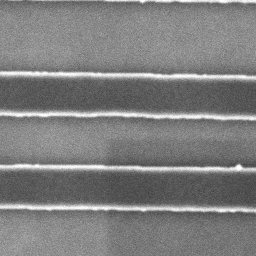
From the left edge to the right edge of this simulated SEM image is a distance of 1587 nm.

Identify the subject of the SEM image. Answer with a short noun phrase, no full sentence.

lines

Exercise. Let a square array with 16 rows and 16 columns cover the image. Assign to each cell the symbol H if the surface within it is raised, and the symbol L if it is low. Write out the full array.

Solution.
LLLLLLLLLLLLLLLL
LLLLLLLLLLLLLLLL
LLLLLLLLLLLLLLLL
LLLLLLLLLLLLLLLL
LLLLLLLLLLLLLLLL
HHHHHHHHHHHHHHHH
HHHHHHHHHHHHHHHH
LLLLLLLLLLLLLLLL
LLLLLLLLLLLLLLLL
LLLLLLLLLLLLLLLL
HHHHHHHHHHHHHHHH
HHHHHHHHHHHHHHHH
HHHHHHHHHHHHHHHH
LLLLLLLLLLLLLLLL
LLLLLLLLLLLLLLLL
LLLLLLLLLLLLLLLL